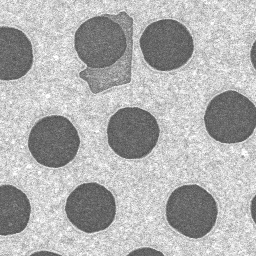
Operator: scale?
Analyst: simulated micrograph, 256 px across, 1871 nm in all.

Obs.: holes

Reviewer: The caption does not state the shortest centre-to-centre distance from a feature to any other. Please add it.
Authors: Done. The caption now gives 79.2 px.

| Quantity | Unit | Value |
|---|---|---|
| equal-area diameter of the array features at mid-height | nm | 382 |